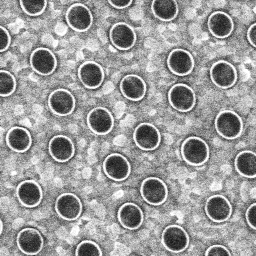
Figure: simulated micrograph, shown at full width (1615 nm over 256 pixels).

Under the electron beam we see a regular array of raised bodies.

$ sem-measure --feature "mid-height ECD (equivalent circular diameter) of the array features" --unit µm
0.162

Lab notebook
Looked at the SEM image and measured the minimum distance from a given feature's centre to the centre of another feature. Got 270 nanometres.